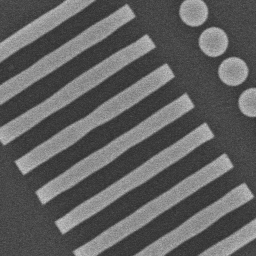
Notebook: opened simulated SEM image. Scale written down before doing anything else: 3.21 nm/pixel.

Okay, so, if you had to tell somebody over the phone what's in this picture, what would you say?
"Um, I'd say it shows groups of lines, slits or small figures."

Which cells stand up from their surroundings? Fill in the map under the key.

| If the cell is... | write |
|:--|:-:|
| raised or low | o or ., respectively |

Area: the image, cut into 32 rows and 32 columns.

........ooo............ooo......
......oooo....ooo......ooo......
....oooo.....ooo.......ooo......
...oooo....oooo...........o.....
.oooo.....ooo............ooo....
oooo....oooo.....oo......ooo....
oo.....ooo.....ooo........oo....
.....oooo....oooo...........oo..
....ooo....oooo.....o......oooo.
..oooo....oooo....oooo.....oooo.
oooo....oooo.....oooo.......oo..
oo.....oooo....oooo...........oo
o.....ooo.....oooo....oo......oo
....oooo....oooo....oooo......oo
..oooo.....oooo....oooo.........
.oooo....oooo....oooo...........
ooo....oooo.....ooo.....oo......
oo....oooo....oooo.....ooo......
....oooo.....ooo.....ooo........
...oooo....oooo....oooo.........
..ooo.....ooo.....oooo....ooo...
........oooo....oooo.....ooo....
.......ooo.....ooo.....oooo.....
.....oooo....oooo....oooo....oo.
.....oo.....ooo.....ooo.....ooo.
..........oooo....oooo.....ooo..
.........ooo.....ooo.....oooo...
.......oooo....oooo....oooo.....
.......oo.....oooo....oooo....oo
............oooo....oooo.....ooo
...........ooo.....oooo....oooo.
.........oooo....oooo....oooo...